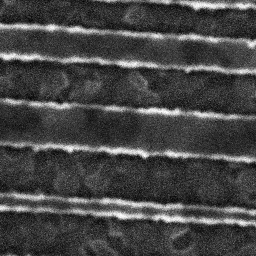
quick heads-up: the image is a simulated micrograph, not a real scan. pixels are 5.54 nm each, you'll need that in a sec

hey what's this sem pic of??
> one or a few lines or trenches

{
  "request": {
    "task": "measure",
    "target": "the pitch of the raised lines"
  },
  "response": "444 nm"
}